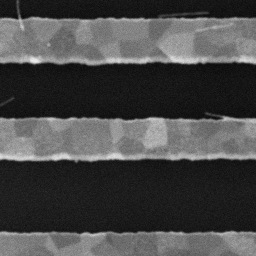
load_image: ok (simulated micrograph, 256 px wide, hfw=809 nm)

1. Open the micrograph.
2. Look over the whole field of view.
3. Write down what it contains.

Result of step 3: lines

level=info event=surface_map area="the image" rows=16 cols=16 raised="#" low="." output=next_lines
................
################
################
################
................
................
................
################
################
################
................
................
................
................
................
################